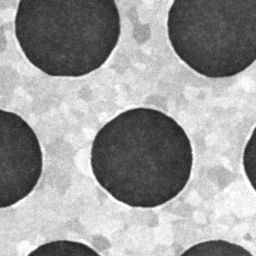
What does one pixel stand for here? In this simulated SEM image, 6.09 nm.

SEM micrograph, holes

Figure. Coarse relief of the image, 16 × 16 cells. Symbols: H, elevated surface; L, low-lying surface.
HLLLLLLHHHHLLLLL
HLLLLLLLHHLLLLLL
HLLLLLLHHHHLLLLL
HHLLLLLHHHHLLLLL
HHHLLLHHHHHHLLLH
HHHHHHHHHHHHHHHH
HHHHHHHHHHHHHHHH
LLHHHHHLLLLHHHHH
LLHHHHLLLLLLHHHH
LLLHHHLLLLLLHHHL
LLLHHHLLLLLLHHHL
LLHHHHLLLLLLHHHH
LHHHHHHLLLLHHHHH
HHHHHHHHHHHHHHHH
HHHHHHHHHHHHHHHH
HHLLLLHHHHHHLLLH